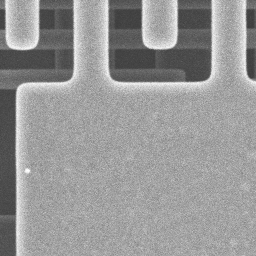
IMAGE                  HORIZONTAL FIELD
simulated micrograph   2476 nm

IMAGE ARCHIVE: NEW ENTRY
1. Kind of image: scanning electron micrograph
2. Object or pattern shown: wiring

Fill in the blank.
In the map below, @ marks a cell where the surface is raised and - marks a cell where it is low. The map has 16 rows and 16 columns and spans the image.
@@---@@--@@--@@-
@@---@@--@@--@@-
@@---@@--@@--@@-
-----@@------@@-
-----@@------@@-
-@@@@@@@@@@@@@@@
-@@@@@@@@@@@@@@@
-@@@@@@@@@@@@@@@
-@@@@@@@@@@@@@@@
-@@@@@@@@@@@@@@@
-@@@@@@@@@@@@@@@
-@@@@@@@@@@@@@@@
-@@@@@@@@@@@@@@@
-@@@@@@@@@@@@@@@
-@@@@@@@@@@@@@@@
-@@@@@@@@@@@@@@@